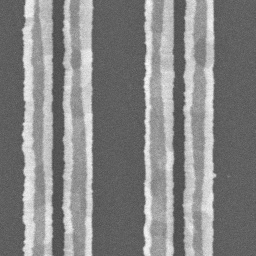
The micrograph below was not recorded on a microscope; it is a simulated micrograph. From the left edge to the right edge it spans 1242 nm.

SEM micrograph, lines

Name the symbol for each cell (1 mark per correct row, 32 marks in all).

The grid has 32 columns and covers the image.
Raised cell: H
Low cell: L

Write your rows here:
LLLLHHLLHHHLLLLLLLLHHLLLHHLLLLLL
LLLLHHLLHHHLLLLLLLHHHLLLHHLLLLLL
LLLLHHLLHHHLLLLLLLHHHLLLHHLLLLLL
LLLHHHLLHHHLLLLLLLHHHLLLHHLLLLLL
LLLHHHLLHHHLLLLLLLHHHLLHHHLLLLLL
LLLHHHLLHHHLLLLLLLLHHLLLHHLLLLLL
LLLHHHLLHHHLLLLLLLLHHLLLHHLLLLLL
LLLHHHLLHHHLLLLLLLHHHLLLHHLLLLLL
LLLHHHLLHHHLLLLLLLHHHLLLHHLLLLLL
LLLLHHLLHHHLLLLLLLHHHLLHHHLLLLLL
LLLHHHLLHHHLLLLLLLHHHLLLHHLLLLLL
LLLHHHLLHHHLLLLLLLHHHLLLHHLLLLLL
LLLLHHLLHHHLLLLLLLHHHLLHHHLLLLLL
LLLLHHLLHHHLLLLLLLHHHLLHHHLLLLLL
LLLLHHLLHHHLLLLLLLHHHLLHHHLLLLLL
LLLHHHLLHHHLLLLLLLHHHLLHHHLLLLLL
LLLHHHLLHHHLLLLLLLHHHLLHHHLLLLLL
LLLHHHLLHHHLLLLLLLHHHLLLHHLLLLLL
LLLHHHLLHHHLLLLLLLHHHLLLHHLLLLLL
LLLLHHLLHHHLLLLLLLHHHLLLHHLLLLLL
LLLLHHLLLHHLLLLLLLHHHLLLHHLLLLLL
LLLLHHLLHHHLLLLLLLHHHLLLHHLLLLLL
LLLLHHLLHHHLLLLLLLHHHLLLHHLLLLLL
LLLLHHLLHHHLLLLLLLHHHLLLHHLLLLLL
LLLHHHLLHHHLLLLLLLHHHLLHHHLLLLLL
LLLHHHLLHHHLLLLLLLHHHLLHHHLLLLLL
LLLHHHLLHHHLLLLLLLHHHLLHHHLLLLLL
LLLHHHLLHHHLLLLLLLHHHLLHHHLLLLLL
LLLLHHLLHHHLLLLLLLHHHLLHHHLLLLLL
LLLLHHLLHHHLLLLLLLHHHLLHHHLLLLLL
LLLHHHLLHHHLLLLLLLHHHLLHHHLLLLLL
LLLHHHLLHHHLLLLLLLHHHLLLHHLLLLLL